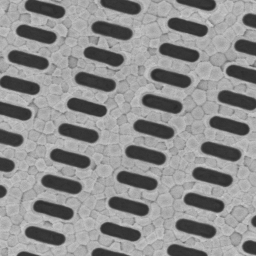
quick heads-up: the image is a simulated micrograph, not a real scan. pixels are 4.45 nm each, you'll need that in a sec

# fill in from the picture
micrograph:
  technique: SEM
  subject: a regular array of holes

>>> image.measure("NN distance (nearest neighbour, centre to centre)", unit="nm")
120